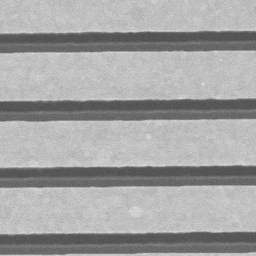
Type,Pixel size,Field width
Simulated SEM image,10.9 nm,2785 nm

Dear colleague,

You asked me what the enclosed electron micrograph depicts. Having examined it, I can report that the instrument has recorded lines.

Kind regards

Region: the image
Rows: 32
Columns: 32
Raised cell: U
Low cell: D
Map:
UUUUUUUUUUUUUUUUUUUUUUUUUUUUUUUU
UUUUUUUUUUUUUUUUUUUUUUUUUUUUUUUU
UUUUUUUUUUUUUUUUUUUUUUUUUUUUUUUU
UUUUUUUUUUUUUUUUUUUUUUUUUUUUUUUU
DDDDDDDDDDDDDDDDDDDDDDDDDDDDDDDD
DDDDDDDDDDDDDDDDDDDDDDDDDDDDDDDD
DDDDDDDDDDDDDDDDDDDDUUUDUUUUUUUU
UUUUUUUUUUUUUUUUUUUUUUUUUUUUUUUU
UUUUUUUUUUUUUUUUUUUUUUUUUUUUUUUU
UUUUUUUUUUUUUUUUUUUUUUUUUUUUUUUU
UUUUUUUUUUUUUUUUUUUUUUUUUUUUUUUU
UUUUUUUUUUUUUUUUUUUUUUUUUUUUUUUU
UUUUUUUUDUUDDDDDDDDDDDDDDDDDDDDD
DDDDDDDDDDDDDDDDDDDDDDDDDDDDDDDD
DDDDDDDDDDDDDDDDDDDDDDDDDDDDDDDD
UUUUUUUUUUUUUUUUUUUUUUUUUUUUUUUU
UUUUUUUUUUUUUUUUUUUUUUUUUUUUUUUU
UUUUUUUUUUUUUUUUUUUUUUUUUUUUUUUU
UUUUUUUUUUUUUUUUUUUUUUUUUUUUUUUU
UUUUUUUUUUUUUUUUUUUUUUUUUUUUUUUU
UUUUUUUUUUUUUUUUUUUUUUUUUUUUUUUU
DDDDDDDDDDDDDDDDDDDDDDDDDDDDDDDD
DDDDDDDDDDDDDDDDDDDDDDDDDDDDDDDD
UUUUUUUUUUUUUUUUUUUUUUUUUUUUUUUU
UUUUUUUUUUUUUUUUUUUUUUUUUUUUUUUU
UUUUUUUUUUUUUUUUUUUUUUUUUUUUUUUU
UUUUUUUUUUUUUUUUUUUUUUUUUUUUUUUU
UUUUUUUUUUUUUUUUUUUUUUUUUUUUUUUU
UUUUUUUUUUUUUUUUUUUUUUUUUUUUUUUU
DDDDDDDDDDDDDDDDDDDDDDDDDDDDDDDD
DDDDDDDDDDDDDDDDDDDDDDDDDDDDDDDD
DDDDDDDDDDDDDDDDDDDDDDDDDDDDDDDD